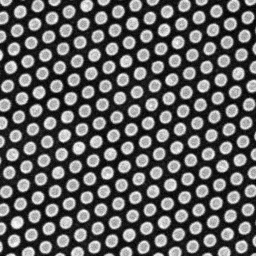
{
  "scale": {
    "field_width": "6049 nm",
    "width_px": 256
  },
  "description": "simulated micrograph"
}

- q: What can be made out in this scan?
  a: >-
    a regular array of raised bodies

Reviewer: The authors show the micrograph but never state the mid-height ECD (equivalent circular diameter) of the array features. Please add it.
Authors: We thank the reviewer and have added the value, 276 nanometres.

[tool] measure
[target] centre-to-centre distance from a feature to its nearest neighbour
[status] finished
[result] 18.3 pixels